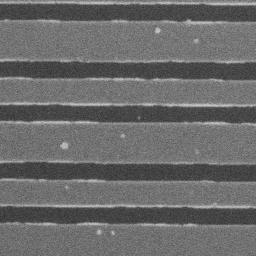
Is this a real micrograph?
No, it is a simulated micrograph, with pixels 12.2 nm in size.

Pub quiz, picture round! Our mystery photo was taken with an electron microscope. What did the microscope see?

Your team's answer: lines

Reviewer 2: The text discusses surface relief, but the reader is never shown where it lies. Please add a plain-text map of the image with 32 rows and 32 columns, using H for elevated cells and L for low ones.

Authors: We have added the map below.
LLLLLLLLLLLLLLLLLLLLLLLLLLLLLLLL
LLLLLLLLLLLLLLLLLLLLLLLLLLLLLLLL
LLLLLLLLLLLLLLLLLLLLLLLLLLLLLLLL
HHHHHHHHHHHHHHHHHHHHHHHHHHHHHHHH
HHHHHHHHHHHHHHHHHHHHHHHHHHHHHHHH
HHHHHHHHHHHHHHHHHHHHHHHHHHHHHHHH
HHHHHHHHHHHHHHHHHHHHHHHHHHHHHHHH
HLHHHHHHHHHHHHHHHHHHHHHHHHHHHHHH
LLLLLLLLLLLLLLLLLLLLLLLLLLLLLLLL
LLLLLLLLLLLLLLLLLLLLLLLLLLLLLLLL
HHHHHHHHHHHHHHHHHHHHHHHHHHHHHHHH
HHHHHHHHHHHHHHHHHHHHHHHHHHHHHHHH
HHHHHHHHHHHHHHHHHHHHHHHHHHHHHHHH
LLLLLLLLLLLLLLLLLLLLLLLLLLLLLLLL
LLLLLLLLLLLLLLLLLLLLLLLLLLLLLLLL
HHHHHHHHHHHHHHHHHHHHHHHHHHHHHLLL
HHHHHHHHHHHHHHHHHHHHHHHHHHHHHHHH
HHHHHHHHHHHHHHHHHHHHHHHHHHHHHHHH
HHHHHHHHHHHHHHHHHHHHHHHHHHHHHHHH
HHHHHHHHHHHHHHHHHHHHHHHHHHHHHHHH
LLLLLLLLLLLLLLLLLLLLLLLLLLLLLLLL
LLLLLLLLLLLLLLLLLLLLLLLLLLLLLLLL
HHHHHHLLLLLLLLLLLLLLLLLLLLLLLLLL
HHHHHHHHHHHHHHHHHHHHHHHHHHHHHHHH
HHHHHHHHHHHHHHHHHHHHHHHHHHHHHHHH
HHHHHHHHHHHHHHHHHHHHHHHHHHHHHHHH
LLLLLLLLLLLLLLLLLLLLLLLLLLLLLLLL
LLLLLLLLLLLLLLLLLLLLLLLLLLLLLLLL
HHHHHHHHHHHHHHHHHHHHHHHHHHHHHHHH
HHHHHHHHHHHHHHHHHHHHHHHHHHHHHHHH
HHHHHHHHHHHHHHHHHHHHHHHHHHHHHHHH
HHHHHHHHHHHHHHHHHHHHHHHHHHHHHHHH